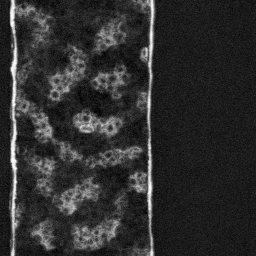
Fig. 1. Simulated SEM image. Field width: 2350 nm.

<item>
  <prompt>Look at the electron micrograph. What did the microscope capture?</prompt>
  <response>one or a few lines or trenches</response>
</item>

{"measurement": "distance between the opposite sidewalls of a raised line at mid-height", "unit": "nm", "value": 1260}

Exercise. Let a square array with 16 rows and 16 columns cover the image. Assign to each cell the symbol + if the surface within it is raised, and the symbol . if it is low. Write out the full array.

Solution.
.++++++++.......
.++++++++.......
.++++++++.......
.++++++++.......
.++++++++.......
.++++++++.......
.++++++++.......
.++++++++.......
.++++++++.......
.++++++++.......
.++++++++.......
.++++++++.......
.++++++++.......
.++++++++.......
.++++++++.......
.++++++++.......